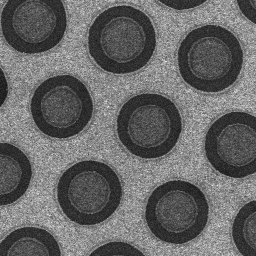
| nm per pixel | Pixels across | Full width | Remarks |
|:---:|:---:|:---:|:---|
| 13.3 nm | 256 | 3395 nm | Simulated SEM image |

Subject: ring-shaped grooves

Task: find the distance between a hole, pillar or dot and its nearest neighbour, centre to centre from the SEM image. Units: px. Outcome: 89.6